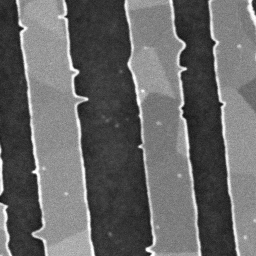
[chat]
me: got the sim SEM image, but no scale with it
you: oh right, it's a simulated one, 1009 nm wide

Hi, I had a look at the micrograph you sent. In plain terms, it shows one or a few lines or trenches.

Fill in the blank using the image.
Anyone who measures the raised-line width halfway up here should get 183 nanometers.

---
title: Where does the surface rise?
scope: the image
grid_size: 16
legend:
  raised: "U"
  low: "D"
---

DUUUDDDDUUUDDUUU
DUUUDDDDUUUDDUUU
DUUUDDDDUUUDDUUU
DUUUDDDDUUUDDUUU
DDUUUDDDUUUDDUUU
DDUUUDDDUUUDDDUU
DDUUUDDDDUUDDDUU
DDUUUDDDDUUUDDUU
DDUUUDDDDUUUDDUU
DDUUUDDDDUUUDDUU
DDUUUDDDDUUUDDUU
DDUUUDDDDUUUDDUU
DDDUUDDDDUUUDDUU
DDDUUUDDDUUUDDDU
DDUUUUDDDDUUDDDU
UDDUUUDDDUUUDDDU